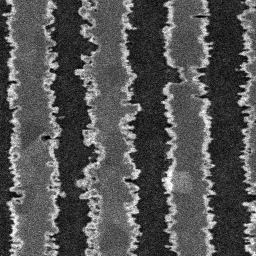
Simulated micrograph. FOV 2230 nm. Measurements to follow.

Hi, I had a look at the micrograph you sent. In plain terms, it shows one or a few lines or trenches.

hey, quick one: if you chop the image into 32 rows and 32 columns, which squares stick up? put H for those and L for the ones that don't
LHHHHHLLLLHHHHHHLLLLLHHHHHLLLLLH
LHHHHHLLLLHHHHHHLLLLLHHHHHLLLLLH
LHHHHHHLLLLHHHHHLLLLLHHHHLLLLLHH
LHHHHHLLLLHHHHHHLLLLLHHHHHLLLLLH
LHHHHHLLLLLHHHHHLLLLLHHHHLLLLLLH
LHHHHHHLLLLLHHHHLLLLLHHHHHLLLLLH
LLHHHHHLLLLLHHHHLLLLLHHHHHLLLLLH
LHHHHHHLLLHHHHHHLLLLLHHHHHLLLLLH
LHHHHHHLLLHHHHHHLLLLLLHHHLLLLLHH
LHHHHHHLLLHHHHHHHLLLLLLHHLLLLLLH
LLHHHHLLLLLHHHHHLLLLLHHHHLLLLLLH
LHHHHHHLLLLHHHHHLLLLLHHHHLLLLLLH
LHHHHHHLLLLHHHHHLLLLLHHHHHLLLLHH
LHHHHHHLLLLHHHHHHLLLLHHHHHLLLLLH
LLHHHHHLLLLHHHHHHLLLLHHHHHLLLLLH
LLHHHHHLLLLHHHHHLLLLLHHHHHLLLLLH
LLHHHHHLLLLHHHHHLLLLLHHHHHLLLLLH
LLHHHLHLLLLHHHHHLLLLLHHHHHLLLLLH
LHHHHHHLLLLLLHHHHLLLLLHHHHLLLLLH
LHHHHHHLLLLLLHHHLLLLLHHHHHLLLLHH
LLHHHHHLLLLHHHHHHLLLLLHHHHLLLLLH
LLHHHHHLLLLHHHHHHLLLLHHHHHLLLLLH
LLHHHHHLLLHHHHHHLLLLLHHHHHLLLLLH
LLHHHHHLLLLHHHHHHLLLLHHHHHLLLLLH
LLHHHHHLLLLHHHHHHLLLLHHHHHLLLLLL
LHHHHHHLLLLLHHHHHLLLLHHHHHLLLLLH
LLHHHHHLLLLHHHHHHLLLLLHHHHLLLLLL
LLHHHHHLLLLLHHHHHLLLLHHHHHLLLLLL
LLHHHHHLLLLHHHHHHLLLLHHHHHLLLLLH
LLHHHHHLLLLHHHHHHLLLLLHHHHLLLLLH
LLHHHHHLLLLHHHHHHLLLLLHHHHLLLLLH
LLHHHHHLLLLHHHHHLLLLLLHHHHLLLLLH